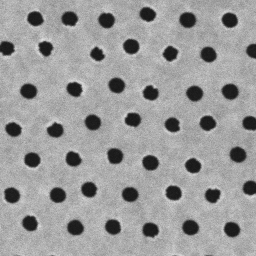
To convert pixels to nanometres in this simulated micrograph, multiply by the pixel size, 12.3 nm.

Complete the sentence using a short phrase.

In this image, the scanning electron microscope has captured a regular array of holes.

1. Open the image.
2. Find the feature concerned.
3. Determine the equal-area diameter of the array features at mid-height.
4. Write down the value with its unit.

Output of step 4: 190 nanometres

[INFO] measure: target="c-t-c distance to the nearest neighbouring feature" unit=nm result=439